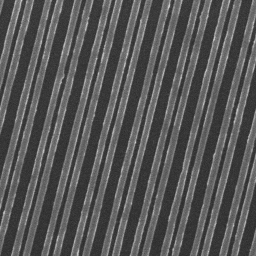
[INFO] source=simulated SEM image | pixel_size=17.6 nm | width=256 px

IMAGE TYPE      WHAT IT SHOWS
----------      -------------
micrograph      parallel lines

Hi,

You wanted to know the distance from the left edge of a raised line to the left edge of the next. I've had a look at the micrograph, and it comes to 252 nm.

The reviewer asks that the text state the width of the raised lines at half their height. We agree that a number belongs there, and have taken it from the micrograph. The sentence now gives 113 nm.